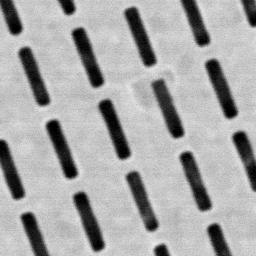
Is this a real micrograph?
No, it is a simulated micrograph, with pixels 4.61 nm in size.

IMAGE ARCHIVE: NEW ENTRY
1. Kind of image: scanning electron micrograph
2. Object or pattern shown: a regular array of holes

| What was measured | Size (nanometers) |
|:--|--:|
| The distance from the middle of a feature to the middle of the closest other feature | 262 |